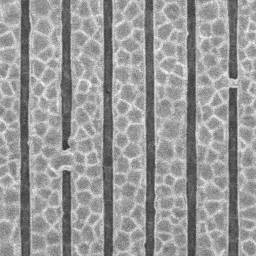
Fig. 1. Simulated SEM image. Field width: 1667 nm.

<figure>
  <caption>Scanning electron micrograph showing parallel lines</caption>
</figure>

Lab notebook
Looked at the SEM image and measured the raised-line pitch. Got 41.4 px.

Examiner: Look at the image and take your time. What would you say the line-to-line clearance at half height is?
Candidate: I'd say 64.3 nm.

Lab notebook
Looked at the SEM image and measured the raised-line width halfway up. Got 205 nm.